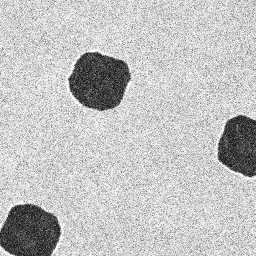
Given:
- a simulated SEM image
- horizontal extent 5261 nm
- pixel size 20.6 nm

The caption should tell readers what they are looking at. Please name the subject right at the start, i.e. holes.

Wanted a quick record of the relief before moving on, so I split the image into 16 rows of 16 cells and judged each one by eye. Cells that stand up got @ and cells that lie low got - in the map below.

@@@@@@@@@@@@@@@@
@@@@@@@@@@@@@@@@
@@@@@@@@@@@@@@@@
@@@@@--@@@@@@@@@
@@@@----@@@@@@@@
@@@@----@@@@@@@@
@@@@@--@@@@@@@@@
@@@@@@@@@@@@@@--
@@@@@@@@@@@@@@--
@@@@@@@@@@@@@@--
@@@@@@@@@@@@@@--
@@@@@@@@@@@@@@@@
@@@@@@@@@@@@@@@@
---@@@@@@@@@@@@@
----@@@@@@@@@@@@
---@@@@@@@@@@@@@